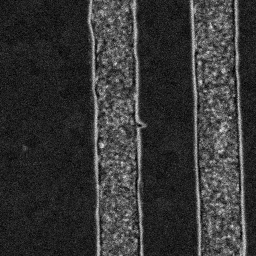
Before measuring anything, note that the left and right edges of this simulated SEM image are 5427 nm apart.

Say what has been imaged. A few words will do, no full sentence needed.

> one or a few lines or trenches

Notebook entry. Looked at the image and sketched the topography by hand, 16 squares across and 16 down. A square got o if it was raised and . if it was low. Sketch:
oooooo..oooo...o
oooooo..oooo...o
oooooo..oooo...o
oooooo...ooo...o
oooooo...ooo...o
oooooo...ooo...o
oooooo...ooo...o
oooooo...ooo...o
oooooo...ooo...o
oooooo...ooo...o
oooooo...ooo...o
oooooo...ooo...o
oooooo...ooo...o
oooooo...ooo...o
oooooo...ooo...o
oooooo...ooo...o